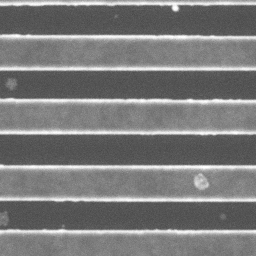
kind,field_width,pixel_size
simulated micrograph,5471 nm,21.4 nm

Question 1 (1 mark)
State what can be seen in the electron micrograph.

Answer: lines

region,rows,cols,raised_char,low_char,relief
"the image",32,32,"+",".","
++++++++++++++++++++++++++++++++
................................
................................
................................
................................
++++++++++++++++++++++++++++++++
++++++++++++++++++++++++++++++++
++++++++++++++++++++++++++++++++
++++++++++++++++++++++++++++++++
................................
................................
................................
+++++++.+++++++.++.+......+.....
++++++++++++++++++++++++++++++++
++++++++++++++++++++++++++++++++
++++++++++++++++++++++++++++++++
++++++++++++++++++++++++++++++++
................................
................................
................................
................................
++++++++++++++++++++++++++++++++
++++++++++++++++++++++++++++++++
++++++++++++++++++++++++++++++++
++++++++++++++++++++++++++++++++
................................
................................
................................
................................
++++++++++++++++++++++++++++++++
++++++++++++++++++++++++++++++++
++++++++++++++++++++++++++++++++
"